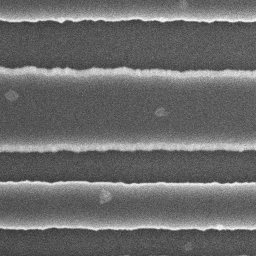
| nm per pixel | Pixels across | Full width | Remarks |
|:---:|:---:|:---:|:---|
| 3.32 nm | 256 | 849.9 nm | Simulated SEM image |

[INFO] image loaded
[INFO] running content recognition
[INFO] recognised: lines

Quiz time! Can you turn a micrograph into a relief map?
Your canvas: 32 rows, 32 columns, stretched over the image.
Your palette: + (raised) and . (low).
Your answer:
++++++++++++++++++++++++++++++++
++++++++++++++++++++++++++++++++
++++++++.+...++...++++.+++++++++
................................
................................
................................
................................
................................
................................
++++++++++++++++++++++++++++++++
++++++++++++++++++++++++++++++++
++++++++++++++++++++++++++++++++
++++++++++++++++++++++++++++++++
++++++++++++++++++++++++++++++++
++++++++++++++++++++++++++++++++
++++++++++++++++++++++++++++++++
++++++++++++++++++++++++++++++++
++++++++++++++++++++++++++++++++
++++++++++++++.++.+..+.++....++.
................................
................................
................................
................................
++++++++++++++++++++++++++++++++
++++++++++++++++++++++++++++++++
++++++++++++++++++++++++++++++++
++++++++++++++++++++++++++++++++
++++++++++++++++++++++++++++++++
++++++.....++++++..+++++++++++++
................................
................................
................................